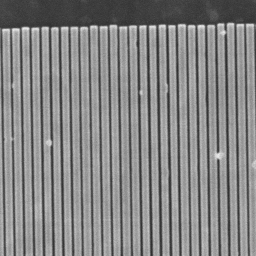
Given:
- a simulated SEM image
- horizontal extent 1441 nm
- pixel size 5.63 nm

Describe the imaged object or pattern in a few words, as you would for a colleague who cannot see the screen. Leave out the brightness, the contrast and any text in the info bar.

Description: parallel lines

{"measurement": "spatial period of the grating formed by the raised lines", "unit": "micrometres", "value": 0.055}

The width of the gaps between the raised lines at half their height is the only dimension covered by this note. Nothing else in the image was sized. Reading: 15.5 nm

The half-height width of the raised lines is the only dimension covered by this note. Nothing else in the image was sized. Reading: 39.4 nm